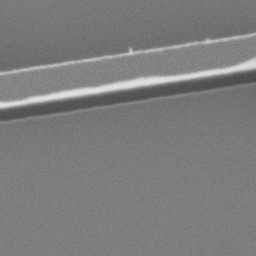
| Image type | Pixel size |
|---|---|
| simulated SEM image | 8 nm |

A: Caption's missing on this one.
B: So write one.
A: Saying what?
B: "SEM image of lines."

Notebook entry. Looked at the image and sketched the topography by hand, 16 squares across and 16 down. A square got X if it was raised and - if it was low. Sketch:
----------------
----------------
--------------XX
-------XXXXXXXXX
XXXXXXXXXXXXXX--
XXXXXXXX--------
X---------------
----------------
----------------
----------------
----------------
----------------
----------------
----------------
----------------
----------------